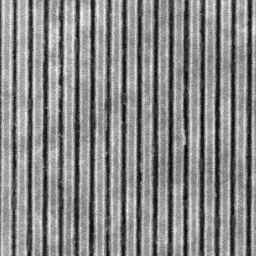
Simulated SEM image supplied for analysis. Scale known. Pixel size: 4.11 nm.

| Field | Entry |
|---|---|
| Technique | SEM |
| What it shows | parallel lines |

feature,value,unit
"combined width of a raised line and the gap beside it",64.4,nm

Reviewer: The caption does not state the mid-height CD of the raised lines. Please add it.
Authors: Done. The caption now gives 29.8 nm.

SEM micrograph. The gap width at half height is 33.4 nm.